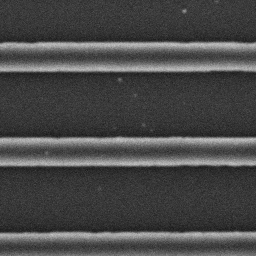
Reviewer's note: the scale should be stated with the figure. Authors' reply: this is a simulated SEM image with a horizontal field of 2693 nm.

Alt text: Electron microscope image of lines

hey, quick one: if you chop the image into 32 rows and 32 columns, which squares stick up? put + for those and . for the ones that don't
................................
................................
................................
................................
................................
+++.+++++++++++++++++++++++++...
++++++++++++++++++++++++++++++++
++++++++++++++++++++++++++++++++
++++++++++++++++++++++++++++++++
................................
................................
................................
................................
................................
................................
................................
................................
++++++++++++.+++++++++++++++++++
++++++++++++++++++++++++++++++++
++++++++++++++++++++++++++++++++
++++++++++++++++++++++......++.+
................................
................................
................................
................................
................................
................................
................................
................................
++++++++++++++++++++++++++++++++
++++++++++++++++++++++++++++++++
++++++++++++++++++++++++++++++++